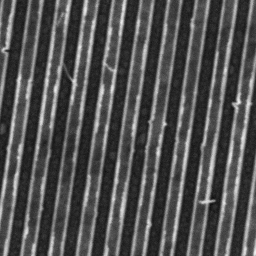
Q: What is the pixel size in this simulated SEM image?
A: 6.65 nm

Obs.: parallel lines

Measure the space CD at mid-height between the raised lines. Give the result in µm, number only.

0.0955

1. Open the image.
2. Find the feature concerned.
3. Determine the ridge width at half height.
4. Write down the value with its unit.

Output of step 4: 0.0889 micrometres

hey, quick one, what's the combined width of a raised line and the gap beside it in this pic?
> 182 nm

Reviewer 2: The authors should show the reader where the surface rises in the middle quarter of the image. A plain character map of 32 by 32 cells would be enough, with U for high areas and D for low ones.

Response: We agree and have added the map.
DDDUUUDDDDUUUDDDDUUUDDDDUUUDDDDU
DDDUUUDDDDUUUDDDDUUUDDDDUUUDDDDU
DDDUUUDDDDUUUDDDDUUUDDDUUUUDDDUU
DDDUUUDDDDUUUDDDDUUUDDDUUUUDDDUU
DDUUUUDDDUUUDDDDUUUDDDDUUUDDDDUU
DDUUUUDDDUUUDDDDUUUDDDDUUUDDDDUU
DDUUUDDDDUUUDDDDUUUDDDDUUUDDDDUU
DDUUUDDDDUUUDDDDUUUDDDDUUUDDDDUU
DDUUUDDDDUUUDDDDUUUDDDDUUUDDDDUU
DDUUUDDDDUUUDDDDUUUDDDUUUUDDDUUU
DDUUUDDDDUUUDDDDUUUDDDUUUUDDDUUU
DUUUUDDDUUUDDDDUUUDDDDUUUDDDDUUU
DUUUUDDDUUUDDDDUUUDDDDUUUDDDDUUU
DUUUDDDDUUUDDDDUUUDDDDUUUDDDDUUU
DUUUDDDDUUUDDDDUUUDDDDUUUDDDDUUU
DUUUDDDDUUUDDDDUUUDDDDUUUDDDDUUU
DUUUDDDDUUUDDDUUUUDDDUUUUDDDUUUU
DUUUDDDDUUUDDDUUUUDDDUUUUDDDUUUU
UUUUDDDUUUDDDDUUUDDDDUUUDDDDUUUD
UUUUDDDUUUDDDDUUUDDDDUUUDDDDUUUD
UUUDDDDUUUDDDDUUUDDDDUUUDDDDUUUD
UUUDDDDUUUDDDDUUUDDDDUUUDDDDUUUD
UUUDDDDUUUDDDDUUUDDDDUUUDDDDUUUD
UUUDDDDUUUDDDDUUUDDDUUUUDDDUUUUD
UUUDDDDUUUDDDDUUUDDDUUUUDDDUUUUD
UUUDDDUUUDDDDUUUDDDDUUUDDDDUUUDD
UUUDDDUUUDDDDUUUDDDDUUUDDDDUUUDD
UUDDDDUUUDDDDUUUDDDDUUUDDDDUUUDD
UUDDDDUUUDDDDUUUDDDDUUUDDDDUUUDD
UUDDDDUUUDDDDUUUDDDDUUUDDDDUUUDD
UUDDDDUUUDDDDUUUDDDUUUUDDDUUUUDD
UUDDDDUUUDDDDUUUDDDUUUUDDDUUUUDD